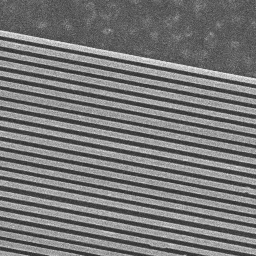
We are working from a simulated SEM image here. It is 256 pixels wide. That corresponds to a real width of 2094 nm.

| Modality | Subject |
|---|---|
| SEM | parallel lines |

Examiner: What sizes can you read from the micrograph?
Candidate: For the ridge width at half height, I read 47.2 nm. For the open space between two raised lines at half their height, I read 32.2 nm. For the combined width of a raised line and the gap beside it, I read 80.4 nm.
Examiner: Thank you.